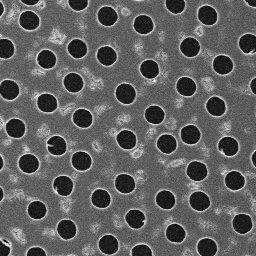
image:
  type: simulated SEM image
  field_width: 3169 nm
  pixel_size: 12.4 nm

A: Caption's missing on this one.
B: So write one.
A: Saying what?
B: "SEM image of a regular array of holes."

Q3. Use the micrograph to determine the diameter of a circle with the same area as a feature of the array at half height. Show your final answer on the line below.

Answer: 246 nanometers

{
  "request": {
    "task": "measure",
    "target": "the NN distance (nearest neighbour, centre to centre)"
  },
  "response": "428 nanometers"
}